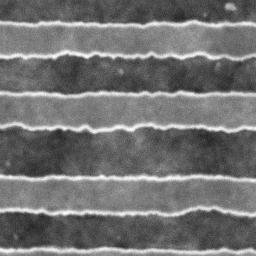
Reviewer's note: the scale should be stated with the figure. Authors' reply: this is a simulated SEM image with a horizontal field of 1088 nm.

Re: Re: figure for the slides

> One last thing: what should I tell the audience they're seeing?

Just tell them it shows lines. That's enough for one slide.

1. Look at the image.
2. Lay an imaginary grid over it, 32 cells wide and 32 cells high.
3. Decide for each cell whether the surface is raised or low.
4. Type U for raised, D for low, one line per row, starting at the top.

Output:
DDDDDDDDDDDDDDDDDDDDDDDDDDDDDDDD
DDDDDDDDDDDDDDDDDDDDDDDDDDDDDDDD
DDDDDDDDDDDDDDDDDDDDDDDDDDDDDDDD
UUUUUUUUUUUUUUUUUUUUUUUUUUUUUUUU
UUUUUUUUUUUUUUUUUUUUUUUUUUUUUUUU
UUUUUUUUUUUUUUUUUUUUUUUUUUUUUUUU
UUUUUUUUUUUUUUUUUUUUUUUUUUUUUUUU
DDDDDDDDDDDDDDDDDDDDDDDDDDDDDUDD
DDDDDDDDDDDDDDDDDDDDDDDDDDDDDDDD
DDDDDDDDDDDDDDDDDDDDDDDDDDDDDDDD
DDDDDDDDDDDDDDDDDDDDDDDDDDDDDDDD
DDDDDDDDDDDDDDDDDDDDDDUDDDDDDDDD
UUUUUUUUUUUUUUUUUUUUUUUUUUUUUUUU
UUUUUUUUUUUUUUUUUUUUUUUUUUUUUUUU
UUUUUUUUUUUUUUUUUUUUUUUUUUUUUUUU
UUUUUUUUUUUUUUUUUUUUUUUUUUUUUUUU
DDDDDDDDDDDDDDDDDDDDDDDDDDDDDDDD
DDDDDDDDDDDDDDDDDDDDDDDDDDDDDDDD
DDDDDDDDDDDDDDDDDDDDDDDDDDDDDDDD
DDDDDDDDDDDDDDDDDDDDDDDDDDDDDDDD
DDDDDDDDDDDDDDDDDDDDDDDDDDDDDDDD
DDDDDDDDDDDDDDDDDDDDDDDDDDDDDDDD
UUUUUUUUUUUUUUUUUUUUUUUUUUUUUUUU
UUUUUUUUUUUUUUUUUUUUUUUUUUUUUUUU
UUUUUUUUUUUUUUUUUUUUUUUUUUUUUUUU
UUUUUUUUUUUUUUUUUUUUUUUUUUUUUUUU
DDDDUUUUUUUUUUUUUUUUUUUDDDDDUUUU
DDDDDDDDDDDDDDDDDDDDDDDDDDDDDDDD
DDDDDDDDDDDDDDDDDDDDDDDDDDDDDDDD
DDDDDDDDDDDDDDDDDDDDDDDDDDDDDDDD
DDDDDDDDDDDDDDDDDDDDDDDDDDDDDDDD
UUUUUUUUUUUUUUUUUUUUUUUUUUUUUUUU